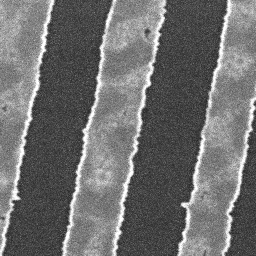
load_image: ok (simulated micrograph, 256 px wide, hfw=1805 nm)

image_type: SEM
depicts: one or a few lines or trenches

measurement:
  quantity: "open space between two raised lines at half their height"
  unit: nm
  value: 431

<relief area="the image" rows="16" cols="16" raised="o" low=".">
ooo....ooo....oo
ooo....ooo....oo
ooo...oooo....oo
ooo...oooo....oo
oo....ooo....ooo
oo....ooo....ooo
oo....ooo....ooo
oo....ooo....ooo
oo...oooo....ooo
o....ooo.....oo.
o....ooo....ooo.
o....ooo....ooo.
o....ooo....ooo.
....oooo....oo..
....ooo.....oo..
....ooo....ooo..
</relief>